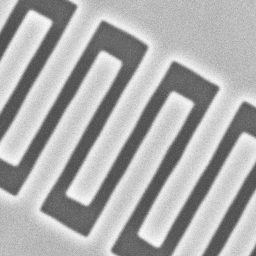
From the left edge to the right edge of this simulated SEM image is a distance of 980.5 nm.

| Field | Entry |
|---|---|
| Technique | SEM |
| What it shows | groups of lines, slits or small figures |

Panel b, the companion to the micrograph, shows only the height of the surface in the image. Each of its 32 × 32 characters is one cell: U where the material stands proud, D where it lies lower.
UUDDDDDDDDUUUUUUUUUUUUUUUUUUUUUU
UDDDDDDDDDUUUUUUUUUUUUUUUUUUUUUU
UDDUUUDDDUUUUUUUUUUUUUUUUUUUUUUU
DDUUUUDDUUUUDDDUUUUUUUUUUUUUUUUU
DDUUUUDDUUUUDDDDDUUUUUUUUUUUUUUU
DUUUUDDUUUUDDDDDDDUUUUUUUUUUUUUU
DUUUDDDUUUDDDDDDDDUUUUUUUUUUUUUU
UUUUDDUUUUDDUUUDDDUUUUUUUUUUUUUU
UUUDDUUUUDDUUUUDDUUUUDDDUUUUUUUU
UUUDDUUUUDDUUUDDDUUUDDDDDUUUUUUU
UUDDUUUUDDUUUUDDUUUUDDDDDDDUUUUU
UUDDUUUDDDUUUDDUUUUDDDDDDDDUUUUU
UDDUUUUDDUUUUDDUUUUDDUUDDDDUUUUU
DDDUUUDDUUUUDDUUUUDDUUUUDDUUUUDD
DDUUUUDDUUUUDDUUUDDDUUUDDDUUUDDD
DDUUUDDUUUUDDUUUUDDUUUUDDUUUUDDD
DUUUUDDUUUDDDUUUDDDUUUDDUUUUDDDD
UUUUDDUUUUDDUUUUDDUUUUDDUUUUDDUU
UUUDDDUUUDDDUUUDDUUUUDDUUUUDDUUU
UUUDDUUUUDDUUUUDDUUUDDDUUUUDDUUU
DDDDDUUUDDUUUUDDUUUUDDUUUUDDUUUU
DDDDUUUUDDUUUDDDUUUDDDUUUDDUUUUD
DDDUUUUDDUUUUDDUUUUDDUUUUDDUUUDD
DDDUUUDDDUUUDDDUUUDDUUUUDDUUUUDD
UUUUUUDDDUUUDDUUUUDDUUUUDDUUUDDD
UUUUUDDDDDDDDUUUUDDUUUUDDUUUUDDU
UUUUUDDDDDDDDUUUUDDUUUDDDUUUDDDU
UUUUUUUDDDDDUUUUDDUUUUDDUUUUDDUU
UUUUUUUUDDDDUUUDDDUUUDDDUUUDDUUU
UUUUUUUUUUDUUUUDDUUUUDDUUUUDDUUU
UUUUUUUUUUUUUUDDDDDUDDUUUUDDUUUU
UUUUUUUUUUUUUUDDDDDDDDUUUDDDUUUD